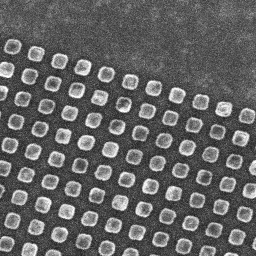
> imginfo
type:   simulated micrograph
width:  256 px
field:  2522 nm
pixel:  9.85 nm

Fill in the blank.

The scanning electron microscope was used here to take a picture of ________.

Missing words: a regular array of raised bodies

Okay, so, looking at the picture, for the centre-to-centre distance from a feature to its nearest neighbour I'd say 0.233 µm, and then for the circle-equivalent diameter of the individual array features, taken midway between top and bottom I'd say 0.146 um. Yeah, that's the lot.